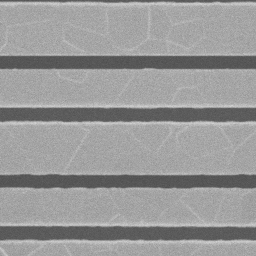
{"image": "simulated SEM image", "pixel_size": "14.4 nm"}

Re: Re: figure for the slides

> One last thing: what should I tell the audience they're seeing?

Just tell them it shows lines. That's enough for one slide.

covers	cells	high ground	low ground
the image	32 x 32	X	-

XXXXXXXXXXXXXXXXXXXXXXXXXXXXXXXX
XXXXXXXXXXXXXXXXXXXXXXXXXXXXXXXX
XXXXXXXXXXXXXXXXXXXXXXXXXXXXXXXX
XXXXXXXXXXXXXXXXXXXXXXXXXXXXXXXX
XXXXXXXXXXXXXXXXXXXXXXXXXXXXXXXX
XXXXXXXXXXXXXXXXXXXXXXXXXXXXXXXX
XXXXXXXXXXXXXXXXXXXXXXXXXXXXXXXX
--------------------------------
--------------------------------
XXXXXXXXXXXXXXXXXXXXXXXXXXXXXXXX
XXXXXXXXXXXXXXXXXXXXXXXXXXXXXXXX
XXXXXXXXXXXXXXXXXXXXXXXXXXXXXXXX
XXXXXXXXXXXXXXXXXXXXXXXXXXXXXXXX
--------------------------------
--------------------------------
XXXXXXXXXXXXXXXXXXXXXXXXXXXXXXXX
XXXXXXXXXXXXXXXXXXXXXXXXXXXXXXXX
XXXXXXXXXXXXXXXXXXXXXXXXXXXXXXXX
XXXXXXXXXXXXXXXXXXXXXXXXXXXXXXXX
XXXXXXXXXXXXXXXXXXXXXXXXXXXXXXXX
XXXXXXXXXXXXXXXXXXXXXXXXXXXXXXXX
XXXXXXXXXXXXXXXXXXXXXXXXXXXXXXXX
--------------------------------
--------------------------------
XXXXXXXXXXXXXXXXXXXXXXXXXXXXXXXX
XXXXXXXXXXXXXXXXXXXXXXXXXXXXXXXX
XXXXXXXXXXXXXXXXXXXXXXXXXXXXXXXX
XXXXXXXXXXXXXXXXXXXXXXXXXXXXXXXX
--------------------------------
--------------------------------
XXXXXXXXXXXXXXXXXXXXXXXXXXXXXXXX
XXXXXXXXXXXXXXXXXXXXXXXXXXXXXXXX